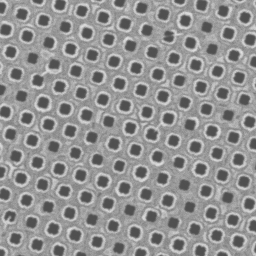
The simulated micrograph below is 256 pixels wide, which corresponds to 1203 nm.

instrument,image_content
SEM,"a regular array of holes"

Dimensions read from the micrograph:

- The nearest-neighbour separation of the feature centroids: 106 nm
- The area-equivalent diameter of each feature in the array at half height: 51.1 nanometers